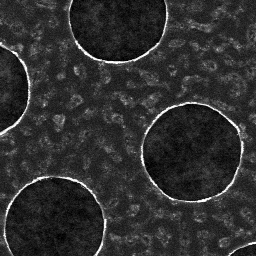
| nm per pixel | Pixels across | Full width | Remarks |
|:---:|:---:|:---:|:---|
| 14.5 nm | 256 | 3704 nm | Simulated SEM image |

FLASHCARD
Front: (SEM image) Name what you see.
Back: holes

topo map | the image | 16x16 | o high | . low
oooo......oooooo
oooo......oooooo
ooooo.....oooooo
.ooooo...ooooooo
..oooooooooooooo
..oooooooooooooo
..oooooooooooooo
.ooooooooo....oo
ooooooooo......o
ooooooooo......o
ooooooooo......o
oo...ooooo....oo
o.....ooooo..ooo
......oooooooooo
......oooooooooo
o.....ooooooooo.